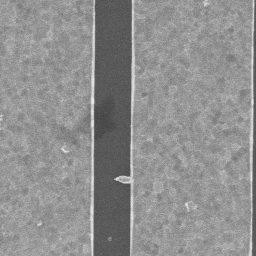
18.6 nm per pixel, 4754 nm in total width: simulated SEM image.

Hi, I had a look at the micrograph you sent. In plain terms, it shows wiring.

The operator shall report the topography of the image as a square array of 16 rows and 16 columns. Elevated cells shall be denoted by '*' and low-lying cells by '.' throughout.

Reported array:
******..********
******..********
******..********
******..********
******..********
******..********
******..********
******..********
******..********
******..********
******..********
******..********
******..********
******..********
******..********
******..********